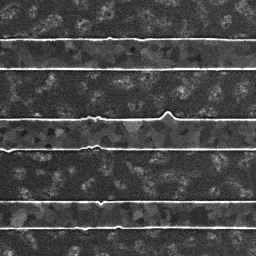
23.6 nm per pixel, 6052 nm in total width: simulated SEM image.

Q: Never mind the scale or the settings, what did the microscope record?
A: one or a few lines or trenches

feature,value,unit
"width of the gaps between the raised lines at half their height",1190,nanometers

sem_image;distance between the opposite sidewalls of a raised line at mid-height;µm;0.715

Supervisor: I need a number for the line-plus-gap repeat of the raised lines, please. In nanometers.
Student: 1900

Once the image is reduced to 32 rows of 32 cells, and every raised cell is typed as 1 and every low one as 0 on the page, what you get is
00000000000000000000000000000000
00000000000000000000000000000000
00000000000000000000000000000000
00000000000000000000000000000000
00000000000000000000000000000000
11111111111111111111111111111111
11111111111111111111111111111111
11111111111111111111111111111111
11111111111111111111111111111111
00000000000000000000000000000000
00000000000000000000000000000000
00000000000000000000000000000000
00000000000000000000000000000000
00000000000000000000000000000000
00000000000000000000110000000000
11111111111111111111111111111111
11111111111111111111111111111111
11111111111111111111111111111111
11111111111001111111111111111111
00000000000000000000000000000000
00000000000000000000000000000000
00000000000000000000000000000000
00000000000000000000000000000000
00000000000000000000000000000000
00000000000000000000000000000000
11111111111111111111111111111111
11111111111111111111111111111111
11111111111111111111111111111111
11111111111111011100100011111111
00000000000000000000000000000000
00000000000000000000000000000000
00000000000000000000000000000000